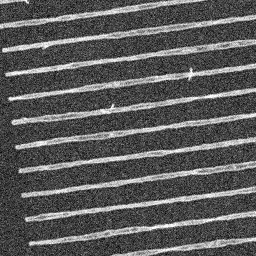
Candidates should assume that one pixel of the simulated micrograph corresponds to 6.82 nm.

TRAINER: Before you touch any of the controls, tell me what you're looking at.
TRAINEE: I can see parallel lines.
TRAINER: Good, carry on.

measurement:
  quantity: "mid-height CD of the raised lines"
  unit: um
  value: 0.0253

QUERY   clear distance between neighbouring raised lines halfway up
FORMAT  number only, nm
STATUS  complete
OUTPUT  144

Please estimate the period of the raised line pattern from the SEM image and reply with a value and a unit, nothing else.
166 nm